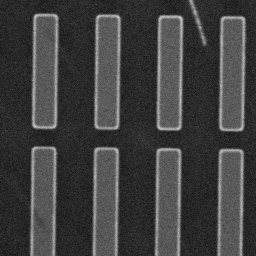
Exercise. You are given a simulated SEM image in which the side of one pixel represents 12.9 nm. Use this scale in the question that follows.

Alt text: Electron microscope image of groups of lines, slits or small figures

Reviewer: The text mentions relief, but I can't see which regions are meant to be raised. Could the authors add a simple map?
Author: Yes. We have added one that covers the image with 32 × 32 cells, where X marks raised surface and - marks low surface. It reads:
--------------------------------
--------------------------------
----XXX-----XXX-----XXX-----XX--
----XXX-----XXX-----XXX-----XX--
----XXX-----XXX-----XXX-----XX--
----XXX-----XXX-----XXX-----XX--
----XXX-----XXX-----XXX-----XX--
----XXX-----XXX-----XXX-----XX--
----XXX-----XXX-----XXX-----XX--
----XXX-----XXX-----XXX-----XX--
----XXX-----XXX-----XXX-----XX--
----XXX-----XXX-----XXX-----XX--
----XXX-----XXX-----XXX-----XX--
----XXX-----XXX-----XXX-----XX--
----XXX-----XXX-----XXX-----XX--
----XXX-----XXX-----XXX-----XX--
--------------------------------
--------------------------------
--------------------------------
----XXX-----XXX-----XX------XX--
----XXX-----XXX-----XX------XX--
----XXX-----XXX-----XX-----XXX--
----XXX-----XXX-----XX-----XXX--
----XXX-----XXX-----XX-----XXX--
----XXX-----XXX-----XX-----XXX--
----XXX-----XXX-----XX-----XXX--
----XXX-----XXX-----XX-----XXX--
----XXX-----XXX-----XX-----XXX--
----XXX-----XXX-----XX-----XXX--
----XXX-----XXX-----XX-----XXX--
----XXX-----XXX-----XX-----XXX--
----XXX-----XXX-----XX-----XXX--